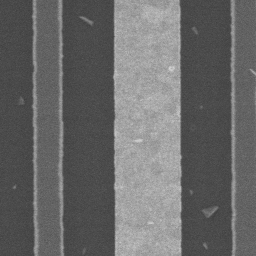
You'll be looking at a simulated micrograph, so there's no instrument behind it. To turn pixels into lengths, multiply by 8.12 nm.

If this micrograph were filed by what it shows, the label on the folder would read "lines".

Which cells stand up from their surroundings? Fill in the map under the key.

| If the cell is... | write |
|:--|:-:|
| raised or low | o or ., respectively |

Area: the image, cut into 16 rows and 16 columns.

..oo...oooo...oo
..oo...oooo...oo
..oo...oooo...oo
..oo...oooo...oo
..oo...oooo...oo
..oo...oooo...oo
..oo...oooo...oo
..oo...oooo...oo
..oo...oooo...oo
..oo...oooo...oo
..oo...oooo...oo
..oo...oooo...oo
..oo...oooo...oo
..oo...oooo...oo
..oo...oooo...oo
..oo...oooo...oo